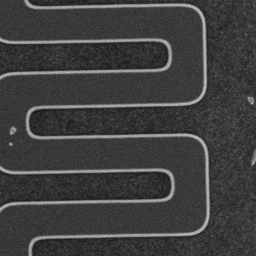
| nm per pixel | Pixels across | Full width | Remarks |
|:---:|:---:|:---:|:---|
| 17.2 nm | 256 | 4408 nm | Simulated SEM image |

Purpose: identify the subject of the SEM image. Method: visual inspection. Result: groups of lines, slits or small figures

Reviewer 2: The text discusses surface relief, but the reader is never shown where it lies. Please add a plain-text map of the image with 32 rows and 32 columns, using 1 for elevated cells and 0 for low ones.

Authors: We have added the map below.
11110000000000000000000000000000
11111111111111111111111110000000
11111111111111111111111110000000
11111111111111111111111111000000
11111111111111111111111111000000
00000000000000000000011111000000
00000000000000000000011111000000
00000000000000000000011111000000
00000000000000000000111111000000
11111111111111111111111111000000
11111111111111111111111111000000
11111111111111111111111110000000
11111111111111111111111110000000
11111000000000000000000000000000
11110000000000000000000000000000
11100000000000000000000000000000
11110000000000000000000000000000
11111111111111111111111110000000
11111111111111111111111111000000
11111111111111111111111111000000
11111111111111111111111111000000
01111111110000000000011111000000
00000000000000000000001111000000
00000000000000000000001111000000
00000000000000000000011111000000
01111111111111111111111111000000
11111111111111111111111111000000
11111111111111111111111111000000
11111111111111111111111110000000
11111111111111000000000000000000
11110000000000000000000000000000
11110000000000000000000000000000